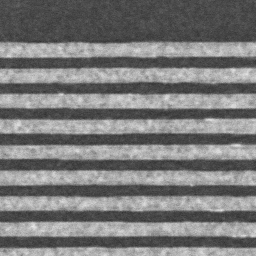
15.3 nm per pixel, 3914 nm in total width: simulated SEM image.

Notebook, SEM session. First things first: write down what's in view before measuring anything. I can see parallel lines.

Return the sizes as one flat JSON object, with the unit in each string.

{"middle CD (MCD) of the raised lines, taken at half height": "189 nm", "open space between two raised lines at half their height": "0.201 micrometres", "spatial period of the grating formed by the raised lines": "392 nanometers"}